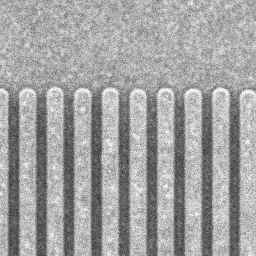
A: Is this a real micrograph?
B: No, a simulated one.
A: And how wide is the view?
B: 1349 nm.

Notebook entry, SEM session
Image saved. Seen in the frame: parallel lines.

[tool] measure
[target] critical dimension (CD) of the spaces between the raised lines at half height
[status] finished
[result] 64.6 nm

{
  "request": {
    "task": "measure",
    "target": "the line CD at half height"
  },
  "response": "0.0798 microns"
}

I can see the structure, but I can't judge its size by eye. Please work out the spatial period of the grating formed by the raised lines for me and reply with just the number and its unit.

0.146 um